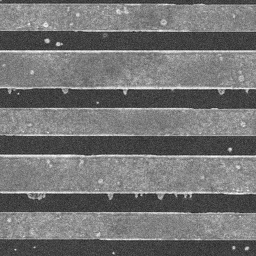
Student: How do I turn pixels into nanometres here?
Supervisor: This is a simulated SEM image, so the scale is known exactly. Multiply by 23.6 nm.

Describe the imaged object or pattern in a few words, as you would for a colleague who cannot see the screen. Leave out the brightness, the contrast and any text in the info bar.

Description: lines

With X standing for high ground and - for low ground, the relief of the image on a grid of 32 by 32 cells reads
--------------------------------
XXXXXXXXXXXXXXXXXXXXXXXXXXXXXXXX
XXXXXXXXXXXXXXXXXXXXXXXXXXXXXXXX
XXXXXXXXXXXXXXXXXXXXXXXXXXXXXXXX
--------------------------------
--------------------------------
XXXXXXXXXXXXXXXXXXXXXXXXXXXXXXX-
XXXXXXXXXXXXXXXXXXXXXXXXXXXXXXXX
XXXXXXXXXXXXXXXXXXXXXXXXXXXXXXXX
XXXXXXXXXXXXXXXXXXXXXXXXXXXXXXXX
XXXXXXXXXXXXXXXXXXXXXXXXXXXXXXXX
--------------------------------
--------------------------------
--------------------------------
XXXXXXXXXXXXXXXXXXXXXXXXXXXXXXXX
XXXXXXXXXXXXXXXXXXXXXXXXXXXXXXXX
XXXXXXXXXXXXXXXXXXXXXXXXXXXXXXXX
--------------------------------
--------------------------------
XXXXXX--------------------------
XXXXXXXXXXXXXXXXXXXXXXXXXXXXXXXX
XXXXXXXXXXXXXXXXXXXXXXXXXXXXXXXX
XXXXXXXXXXXXXXXXXXXXXXXXXXXXXXXX
XXXXXXXXXXXXXXXXXXXXXXXXXXXXXXXX
--------------------------------
--------------------------------
--------------------------------
XXXXXXXXXXXXXXXXXXXXXXXXXXXXXXXX
XXXXXXXXXXXXXXXXXXXXXXXXXXXXXXXX
XXXXXXXXXXXXXXXXXXXXXXXXXXXXXXXX
--------------------------------
--------------------------------